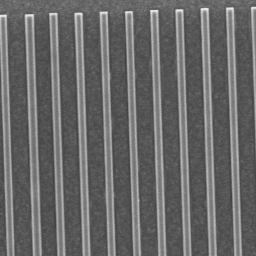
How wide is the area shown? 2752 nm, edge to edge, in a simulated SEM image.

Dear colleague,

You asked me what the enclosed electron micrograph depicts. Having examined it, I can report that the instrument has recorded parallel lines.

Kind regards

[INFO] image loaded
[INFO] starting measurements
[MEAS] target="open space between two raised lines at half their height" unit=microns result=0.204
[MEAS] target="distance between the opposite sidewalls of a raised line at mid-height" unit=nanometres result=73.9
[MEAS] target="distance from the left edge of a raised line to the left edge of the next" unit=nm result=271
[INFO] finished